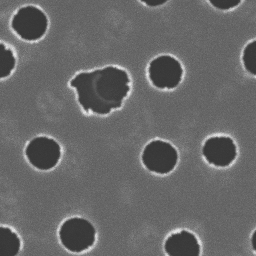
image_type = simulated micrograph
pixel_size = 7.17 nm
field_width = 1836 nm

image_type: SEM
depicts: holes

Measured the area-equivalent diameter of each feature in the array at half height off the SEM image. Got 243 nm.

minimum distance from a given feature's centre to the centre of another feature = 622 nanometres